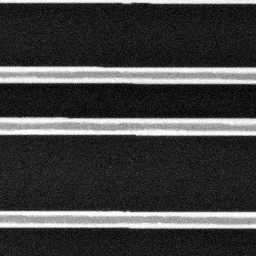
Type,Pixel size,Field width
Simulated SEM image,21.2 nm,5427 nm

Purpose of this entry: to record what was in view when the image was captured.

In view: lines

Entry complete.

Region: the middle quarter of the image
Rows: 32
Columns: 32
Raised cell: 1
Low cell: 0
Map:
00000000000000000000000000000000
11111111111111111111111111111111
11111111111111111111111111111111
11111111111111111111111111111111
00011110000001111111111111111111
00000000000000000000000000000000
00000000000000000000000000000000
00000000000000000000000000000000
00000000000000000000000000000000
00000000000000000000000000000000
00000000000000000000000000000000
00000000000000000000000000000000
00000000000000000000000000000000
00000000000000000000000000000000
11111111111111111111111111111111
11111111111111111111111111111111
11111111111111111111111111111111
00111111111111111111111111111111
00000000000000000000000000000000
00000000000000000000000000000000
00000000000000000000000000000000
00000000000000000000000000000000
00000000000000000000000000000000
00000000000000000000000000000000
00000000000000000000000000000000
00000000000000000000000000000000
00000000000000000000000000000000
00000000000000000000000000000000
00000000000000000000000000000000
00000000000000000000000000000000
00000000000000000000000000000000
00000000000000000000000000000000